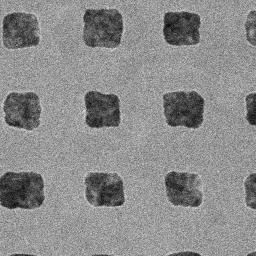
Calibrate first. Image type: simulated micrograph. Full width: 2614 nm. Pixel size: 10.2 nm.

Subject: a regular array of holes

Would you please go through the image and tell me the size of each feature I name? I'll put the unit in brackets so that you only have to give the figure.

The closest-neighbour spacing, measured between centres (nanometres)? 810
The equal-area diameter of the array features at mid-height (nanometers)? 407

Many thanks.